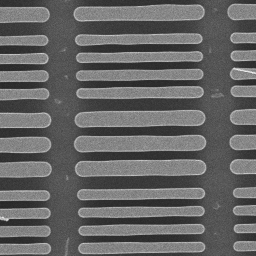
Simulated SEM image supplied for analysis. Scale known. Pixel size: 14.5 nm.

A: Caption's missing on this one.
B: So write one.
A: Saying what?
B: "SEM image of groups of lines, slits or small figures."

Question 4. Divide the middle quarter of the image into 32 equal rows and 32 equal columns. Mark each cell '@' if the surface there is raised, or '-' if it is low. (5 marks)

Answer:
--------------------------------
-------------@@@@@@@@@-@@@@@@@@@
---@@@@@@@@@@@@@@@@@@@@@@@@@@@@@
---@@@@@@@@@@@@@@@@@@@@@@@@@@@@@
--------------------------------
--------------------------------
---@@@@@@@@@@@@@@@@@@@@@@@@@@@@@
---@@@@@@@@@@@@@@@@@@@@@@@@@@@@@
-------@@@@@@@@@@@--------------
--------------------------------
--------------------------------
--------------------------------
---@@@@@@@@@@@@@@@@@@@@@@@@@@@@@
---@@@@@@@@@@@@@@@@@@@@@@@@@@@@@
---@@@@@@@@@@@@@@@@@@@@@@@@@@@@@
----@@@@@@@@@@@@@@@@@-----------
--------------------------------
--------------------------------
---@@@@@@@@@@@@@@@@@@@@@@@@@@@@@
---@@@@@@@@@@@@@@@@@@@@@@@@@@@@@
---@@@@@@@@@@@@@@@@@@@@@@@@@@@@@
---@@@@@@@@@@@@@@@@@@@@@@@@@@@@@
--------------------------------
--------------------------------
----@@@@@@@@@@@@@@@@@@@@@@@@@@@@
---@@@@@@@@@@@@@@@@@@@@@@@@@@@@@
---@@@@@@@@@@@@@@@@@@@@@@@@@@@@@
---@@@@@@@@@@@@@@@@@@@@@@@@@@@@@
--------------------------------
--------------------------------
--------------------------------
-------------@@@@@@@@@@@@@@@@@@@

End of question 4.